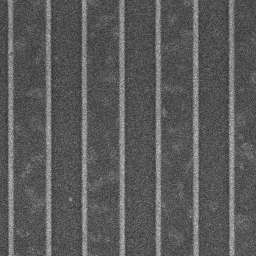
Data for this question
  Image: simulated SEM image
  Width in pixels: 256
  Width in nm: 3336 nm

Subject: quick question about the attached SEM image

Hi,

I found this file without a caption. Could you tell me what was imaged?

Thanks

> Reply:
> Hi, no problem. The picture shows one or a few lines or trenches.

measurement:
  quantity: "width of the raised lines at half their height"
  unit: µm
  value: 0.487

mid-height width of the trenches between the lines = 462 nm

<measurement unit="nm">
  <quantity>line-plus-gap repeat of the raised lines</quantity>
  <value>961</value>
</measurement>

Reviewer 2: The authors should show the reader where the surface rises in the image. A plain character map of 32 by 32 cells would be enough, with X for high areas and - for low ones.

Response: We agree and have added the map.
-XXXXX-----XXXX-----XXXX-----XXX
-XXXXX-----XXXX-----XXXX-----XXX
-XXXXX-----XXXX-----XXXX-----XXX
-XXXXX-----XXXX-----XXXX-----XXX
-XXXXX-----XXXX-----XXXX-----XXX
-XXXXX-----XXXX-----XXXX-----XXX
-XXXXX-----XXXX-----XXXX-----XXX
-XXXXX-----XXXX-----XXXX-----XXX
-XXXXX-----XXXX-----XXXX-----XXX
-XXXXX-----XXXX-----XXXX-----XXX
-XXXXX-----XXXX-----XXXX-----XXX
-XXXXX-----XXXX-----XXXX-----XXX
-XXXXX-----XXXX-----XXXX-----XXX
-XXXXX-----XXXX-----XXXX-----XXX
-XXXXX-----XXXX-----XXXX-----XXX
-XXXXX-----XXXX-----XXXX-----XXX
-XXXXX-----XXXX-----XXXX-----XXX
-XXXXX-----XXXX-----XXXX-----XXX
-XXXXX-----XXXX-----XXXX-----XXX
-XXXXX-----XXXX-----XXXX-----XXX
-XXXXX-----XXXX-----XXXX-----XXX
-XXXXX-----XXXX-----XXXX-----XXX
-XXXXX-----XXXX-----XXXX-----XXX
-XXXXX-----XXXX-----XXXX-----XXX
-XXXXX-----XXXX-----XXXX-----XXX
-XXXXX-----XXXX-----XXXX-----XXX
-XXXXX-----XXXX-----XXXX-----XXX
-XXXXX-----XXXX-----XXXX-----XXX
-XXXXX-----XXXX-----XXXX-----XXX
-XXXXX-----XXXX-----XXXX-----XXX
-XXXXX-----XXXX-----XXXX-----XXX
-XXXXX-----XXXX-----XXXX-----XXX